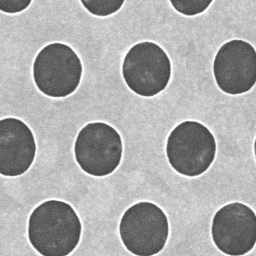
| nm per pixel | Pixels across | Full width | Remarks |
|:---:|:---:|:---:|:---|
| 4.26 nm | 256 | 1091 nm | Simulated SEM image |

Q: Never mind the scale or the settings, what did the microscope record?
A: holes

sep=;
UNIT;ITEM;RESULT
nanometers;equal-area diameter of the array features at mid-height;223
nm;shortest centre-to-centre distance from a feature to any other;380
